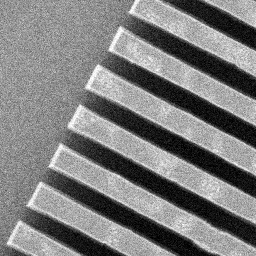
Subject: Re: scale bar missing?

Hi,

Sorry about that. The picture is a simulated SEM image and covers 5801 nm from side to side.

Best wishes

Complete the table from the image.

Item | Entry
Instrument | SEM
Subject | parallel lines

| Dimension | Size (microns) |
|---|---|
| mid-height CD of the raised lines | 0.539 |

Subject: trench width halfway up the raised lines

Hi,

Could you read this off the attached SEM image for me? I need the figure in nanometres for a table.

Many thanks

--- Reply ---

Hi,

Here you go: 441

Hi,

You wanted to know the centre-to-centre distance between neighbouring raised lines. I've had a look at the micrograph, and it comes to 978 nm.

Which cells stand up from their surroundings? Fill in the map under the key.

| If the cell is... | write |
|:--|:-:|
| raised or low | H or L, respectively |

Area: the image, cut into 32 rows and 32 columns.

LLLLLLLLLLLLLLLLLHHHHLLLLLHHHHHH
LLLLLLLLLLLLLLLLLHHHHHHLLLLLHHHH
LLLLLLLLLLLLLLLLLLHHHHHHHLLLLLHH
LLLLLLLLLLLLLLLLLLLLHHHHHHLLLLLL
LLLLLLLLLLLLLLLHHLLLLLHHHHHHLLLL
LLLLLLLLLLLLLLHHHHHLLLLLHHHHHHLL
LLLLLLLLLLLLLLHHHHHHLLLLLLHHHHHH
LLLLLLLLLLLLLLLLHHHHHHLLLLLLHHHH
LLLLLLLLLLLLLLLLLLHHHHHHLLLLLLHH
LLLLLLLLLLLLHHHLLLLLHHHHHHLLLLLL
LLLLLLLLLLLHHHHHLLLLLLHHHHHHLLLL
LLLLLLLLLLLLHHHHHHLLLLLLHHHHHHLL
LLLLLLLLLLLLLLHHHHHHLLLLLLHHHHHH
LLLLLLLLLLLLLLLLHHHHHHLLLLLLHHHH
LLLLLLLLLLHHLLLLLLHHHHHHLLLLLHHH
LLLLLLLLLHHHHHLLLLLHHHHHHHLLLLLH
LLLLLLLLLLHHHHHHLLLLLHHHHHHHLLLL
LLLLLLLLLLLLHHHHHHLLLLLHHHHHHHLL
LLLLLLLLLLLLLLHHHHHHLLLLLHHHHHHH
LLLLLLLHHHLLLLLHHHHHHHLLLLLHHHHH
LLLLLLHHHHHHLLLLLHHHHHHHLLLLLHHH
LLLLLLLLHHHHHHLLLLLHHHHHHHLLLLLH
LLLLLLLLLLHHHHHHLLLLLHHHHHHHLLLL
LLLLLHLLLLLHHHHHHHLLLLLHHHHHHHLL
LLLLHHHHLLLLLHHHHHHHLLLLLHHHHHHL
LLLLHHHHHHLLLLLHHHHHHHLLLLLHHHHH
LLLLLHHHHHHHLLLLLHHHHHHLLLLLLHHH
LLLLLLLHHHHHHHLLLLLHHHHHHHLLLLLH
LLHHLLLLLHHHHHHHLLLLLHHHHHHLLLLL
LLHHHHLLLLLHHHHHHHLLLLLHHHHHHLLL
LHHHHHHHLLLLLHHHHHHLLLLLHHHHHHHL
LLLHHHHHHHLLLLLHHHHHHLLLLLHHHHHH